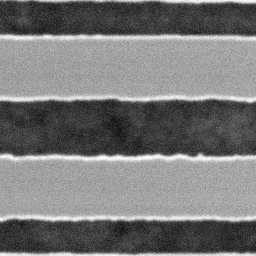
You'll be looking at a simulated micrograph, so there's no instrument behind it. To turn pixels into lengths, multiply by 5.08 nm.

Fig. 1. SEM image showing lines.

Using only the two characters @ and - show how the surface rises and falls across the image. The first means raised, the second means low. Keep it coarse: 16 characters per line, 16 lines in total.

----------------
----------------
@@@@@@@@@@@@@@@@
@@@@@@@@@@@@@@@@
@@@@@@@@@@@@@@@@
@@@@@@@@@@@@@@@@
----------------
----------------
----------------
----------------
@@@@@@@@@@@@@@@@
@@@@@@@@@@@@@@@@
@@@@@@@@@@@@@@@@
@@@@@@@@@@@@@@@@
----------------
----------------